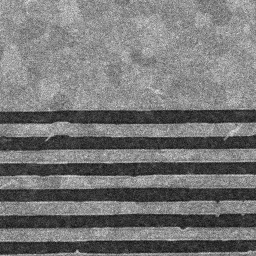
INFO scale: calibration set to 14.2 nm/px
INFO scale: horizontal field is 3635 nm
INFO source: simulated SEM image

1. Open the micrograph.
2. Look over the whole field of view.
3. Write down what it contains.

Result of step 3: parallel lines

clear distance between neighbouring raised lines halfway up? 197 nm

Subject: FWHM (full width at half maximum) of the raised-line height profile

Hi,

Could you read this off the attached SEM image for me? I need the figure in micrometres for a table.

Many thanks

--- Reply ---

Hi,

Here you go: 0.174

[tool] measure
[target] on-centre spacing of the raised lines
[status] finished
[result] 370 nm